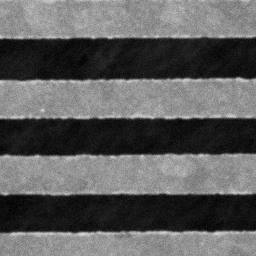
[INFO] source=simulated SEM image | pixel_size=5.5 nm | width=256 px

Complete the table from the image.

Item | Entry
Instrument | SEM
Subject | lines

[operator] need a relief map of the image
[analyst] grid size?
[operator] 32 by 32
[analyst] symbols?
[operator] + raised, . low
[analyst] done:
++++++++++++++++++++++++++++++++
++++++++++++++++++++++++++++++++
++++++++++++++++++++++++++++++++
++++++++++++++++++++++++++++++++
++++++++++++++++++++++++++++++++
................................
................................
................................
................................
................................
++++++++++++++++++++++++++++++++
++++++++++++++++++++++++++++++++
++++++++++++++++++++++++++++++++
++++++++++++++++++++++++++++++++
++++++++++++++++++++++++++++++++
................................
................................
................................
................................
++..+....++++..+++++++++++++++++
++++++++++++++++++++++++++++++++
++++++++++++++++++++++++++++++++
++++++++++++++++++++++++++++++++
++++++++++++++++++++++++++++++++
................................
................................
................................
................................
................................
++++++++++++++++++++++++++++++++
++++++++++++++++++++++++++++++++
++++++++++++++++++++++++++++++++